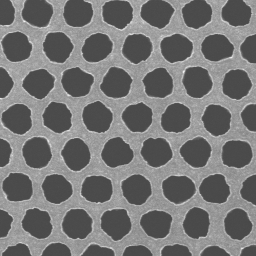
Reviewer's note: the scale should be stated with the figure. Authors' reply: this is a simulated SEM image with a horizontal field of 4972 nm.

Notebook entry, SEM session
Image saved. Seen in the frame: a regular array of holes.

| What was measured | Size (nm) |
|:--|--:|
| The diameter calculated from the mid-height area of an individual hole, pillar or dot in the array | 584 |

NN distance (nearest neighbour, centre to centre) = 758 nm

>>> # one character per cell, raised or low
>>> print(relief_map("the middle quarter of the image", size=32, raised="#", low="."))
################################
....#######....########...####..
......#####.....#####.....####..
.......###.......###.......###..
.......###.......###.......##...
.......##........###.......###..
.......##.......####.......###..
#.....####......#####.....#####.
############..#########..#######
########.#######################
.####.....######.....#####....##
.####......####.......###......#
..##........##........##........
..##........###.......##........
..###.......###.......##........
..####.....#####.....###.......#
.#####.....#####.....####.....##
################################
###.########..#######.#.########
#....######....#####......#####.
......####......####......###...
......####.......##........##...
.......##.........#........##...
.......##........###.......###..
......####.......####.....#####.
#.....#####...########..########
##..############################
################################
#####......#####....######.....#
.####.......###......####.......
..##........##........##........
..##........##........###.......